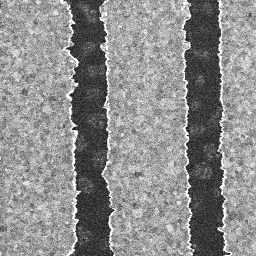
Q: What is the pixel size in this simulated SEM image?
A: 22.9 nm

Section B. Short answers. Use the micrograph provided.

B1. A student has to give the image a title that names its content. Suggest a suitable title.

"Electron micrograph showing one or a few lines or trenches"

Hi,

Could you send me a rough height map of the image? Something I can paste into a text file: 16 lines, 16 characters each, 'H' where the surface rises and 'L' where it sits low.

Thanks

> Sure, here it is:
HHHHLLHHHHHHLLHH
HHHHLLHHHHHHLLHH
HHHHLLLHHHHHLLHH
HHHHLLLHHHHHLLHH
HHHHHLLHHHHHLLHH
HHHHHLLHHHHHLLHH
HHHHLLLHHHHHLLHH
HHHHLLLHHHHHLLHH
HHHHHLLHHHHHLLHH
HHHHHLLHHHHHLLHH
HHHHHLLHHHHHLLHH
HHHHHLLHHHHHLLHH
HHHHHLLHHHHHLLHH
HHHHHLLHHHHHLLHH
HHHHHLLHHHHHLLHH
HHHHHLLHHHHHLLHH